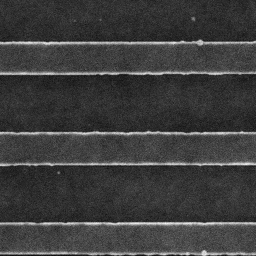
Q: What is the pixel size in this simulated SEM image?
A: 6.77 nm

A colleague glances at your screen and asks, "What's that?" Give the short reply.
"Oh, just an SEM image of lines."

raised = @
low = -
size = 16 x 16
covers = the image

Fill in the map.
----------------
----------------
----------------
@@@@@@@@@@@@@@@@
@@@@@@@@@@@@@@@@
----------------
----------------
----------------
@@@@@@@@@@@@@@@@
@@@@@@@@@@@@@@@@
----------------
----------------
----------------
----------------
@@@@@@@@@@@@@@@@
@@@@@@@@@@@@@@@@